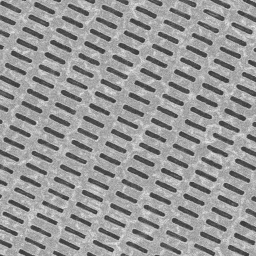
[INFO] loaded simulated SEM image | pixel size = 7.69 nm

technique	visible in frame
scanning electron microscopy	a regular array of holes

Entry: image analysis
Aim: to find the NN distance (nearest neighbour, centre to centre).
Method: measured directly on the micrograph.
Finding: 104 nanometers